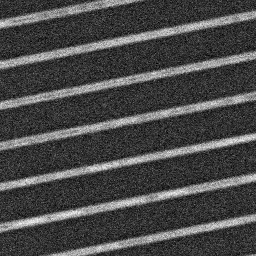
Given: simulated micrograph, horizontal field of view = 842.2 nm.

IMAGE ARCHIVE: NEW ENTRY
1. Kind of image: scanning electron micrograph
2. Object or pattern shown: parallel lines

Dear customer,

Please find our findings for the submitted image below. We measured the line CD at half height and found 0.0205 µm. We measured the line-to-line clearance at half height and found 0.112 micrometres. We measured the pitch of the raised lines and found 0.131 µm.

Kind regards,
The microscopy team